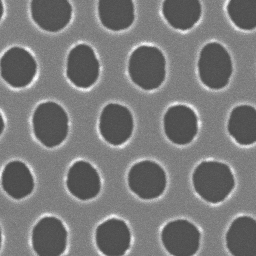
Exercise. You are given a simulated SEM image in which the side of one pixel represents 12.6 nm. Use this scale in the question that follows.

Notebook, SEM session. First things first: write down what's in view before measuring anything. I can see a regular array of holes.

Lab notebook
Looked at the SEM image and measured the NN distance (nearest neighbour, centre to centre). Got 813 nanometers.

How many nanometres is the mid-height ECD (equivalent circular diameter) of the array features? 493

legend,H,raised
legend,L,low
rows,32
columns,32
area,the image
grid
HHHHLLLLLHHHLLLLLHHHLLLLLHHHLLLL
HHHHLLLLLHHHLLLLLHHHLLLLLHHHLLLL
HHHHLLLLLHHHHLLLLHHHHLLLLHHHHLLL
HHHHHLLLHHHHHLLLHHHHHHLLHHHHHHLL
HHHHHHHHHHHHHHHHHHHHHHHHHHHHHHHH
HHHHHHHHHHLHHHHHHHHHHHHHHHLLHHHH
HLLLHHHHHLLLHHHHHLLLHHHHHLLLHHHH
LLLLHHHHLLLLHHHHLLLLLHHHHLLLLHHH
LLLLLHHHLLLLLHHHLLLLLHHHHLLLLHHH
LLLLHHHHLLLLHHHHLLLLLHHHHLLLLHHH
HLLLHHHHHLLLHHHHHLLLHHHHHHLLHHHH
HHHHHHHHHHHHHHHHHHHHHHHHHHHHHHHH
HHHHHHHHHHHHHHHHHHHHHHHHHHHHHHHH
HHHHLLLLHHHHHLLLHHHHHLLLHHHHHLLL
HHHHLLLLHHHHLLLLLHHHHLLLLHHHHLLL
LHHHLLLLLHHHLLLLLHHHLLLLLHHHLLLL
HHHHLLLLHHHHLLLLLHHHHLLLLHHHHLLL
HHHHHLLLHHHHHLLLHHHHHLLLHHHHHLLL
HHHHHHHHHHHHHHHHHHHHHHHHHHHHHHHH
HHHHHHHHHHHHHHHHHHHHHHHHHHHHHHHH
HLLHHHHHHLLHHHHHHLLLHHHHHLLLHHHH
LLLLHHHHHLLLHHHHLLLLLHHHLLLLLHHH
LLLLHHHHLLLLLHHHLLLLLHHHLLLLLHHH
LLLLHHHHLLLLLHHHLLLLLHHHLLLLLHHH
HLLHHHHHHLLLHHHHHLLLHHHHHLLLHHHH
HHHHHHHHHHHHHHHHHHHHHHHHHHHHHHHH
HHHHHHHHHHHHHHHHHHHHHHHHHHHHHHHH
HHHHHLLLHHHHHLLHHHHHHHLHHHHHHLLL
HHHHLLLLHHHHLLLLHHHHLLLLLHHHHLLL
HHHHLLLLHHHHLLLLHHHHLLLLLHHHLLLL
HHHHLLLLHHHHLLLLHHHHLLLLLHHHLLLL
HHHHLLLLHHHHHLLLHHHHHLLLLHHHHLLL